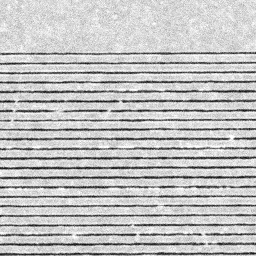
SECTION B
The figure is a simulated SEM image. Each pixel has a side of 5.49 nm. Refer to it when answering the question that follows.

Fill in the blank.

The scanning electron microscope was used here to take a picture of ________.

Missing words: parallel lines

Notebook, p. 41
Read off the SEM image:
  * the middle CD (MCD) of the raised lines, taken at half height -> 37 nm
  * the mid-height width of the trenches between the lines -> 15.8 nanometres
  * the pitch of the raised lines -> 0.0523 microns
